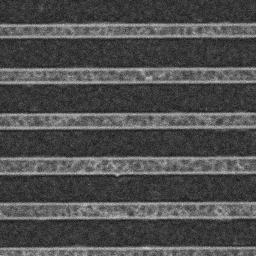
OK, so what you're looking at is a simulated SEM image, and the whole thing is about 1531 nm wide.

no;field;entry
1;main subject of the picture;parallel lines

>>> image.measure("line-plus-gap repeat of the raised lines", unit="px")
45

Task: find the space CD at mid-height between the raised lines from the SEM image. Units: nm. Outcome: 184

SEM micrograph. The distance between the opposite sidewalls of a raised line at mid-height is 0.0868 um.